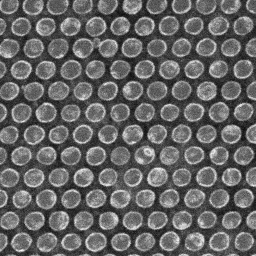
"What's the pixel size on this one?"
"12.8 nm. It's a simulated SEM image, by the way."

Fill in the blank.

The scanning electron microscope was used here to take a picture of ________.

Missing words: a regular array of raised bodies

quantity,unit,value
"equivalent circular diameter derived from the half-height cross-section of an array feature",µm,0.237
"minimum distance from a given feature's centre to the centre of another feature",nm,314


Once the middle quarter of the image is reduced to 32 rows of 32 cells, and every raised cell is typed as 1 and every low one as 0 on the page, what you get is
11110011110011110011110011111001
11110111110011110011110011111011
11110011110011110011110011110011
11000001100001100000100000000000
00000000000000000100000100000100
10011110011110011110011110011111
10011110011110011110011111011111
10011110011110011110011111011110
00011100011100001100001100001100
00000000000000000000000000000000
01100011110001110001110001110001
11110011110011110011111011111011
11110011110011110011111011111011
11100011110011110011110001110001
00000000000000000000000000000000
00001100000100000100000100000100
10011110011110011110011110011111
10011110011110011111011111011111
10011110011110011110011110011111
00011100001100001100001100000100
00000000000000000000000000000000
11110011110011110011110001110001
11110011110011110011111011111011
11110011110011110011110011111011
11100011100011110001110001110001
00000000000000000000000000000000
00001100001100001110001110000110
10011110011110011110011111001111
10011110011110011110011111011111
00011110011110011110011110001110
00001100000000000000000000000000
00000000000000000000000000000000